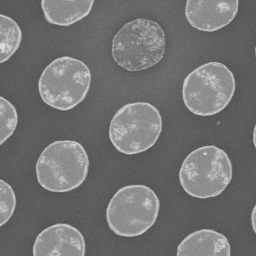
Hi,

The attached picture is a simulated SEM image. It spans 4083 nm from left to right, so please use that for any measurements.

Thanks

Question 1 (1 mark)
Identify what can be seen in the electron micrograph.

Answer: raised bodies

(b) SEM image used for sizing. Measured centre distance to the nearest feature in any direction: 1.32 micrometres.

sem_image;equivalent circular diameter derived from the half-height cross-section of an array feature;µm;0.825